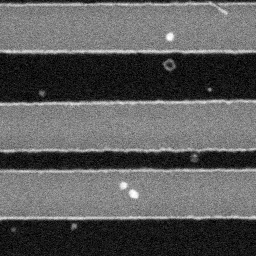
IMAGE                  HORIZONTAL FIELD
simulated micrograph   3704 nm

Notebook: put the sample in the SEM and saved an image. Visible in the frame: lines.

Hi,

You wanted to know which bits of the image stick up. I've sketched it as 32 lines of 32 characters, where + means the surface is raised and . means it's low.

++++++++++++++++++++++....+.....
................................
................................
................................
................................
................................
++++++++++++++++++++++++++++++++
++++++++++++++++++++++++++++++++
++++++++++++++++++++++++++++++++
++++++++++++++++++++++++++++++++
++++++++++++++++++++++++++++++++
++++++++++++++++++++++++++++++++
++++++++++++++++++++++++++++++++
................................
................................
................................
................................
................................
................................
++++++++++++++++++++++++++++++++
++++++++++++++++++++++++++++++++
................................
................................
................................
................................
................................
................................
++++++++++++++++++++++++++++++++
++++++++++++++++++++++++++++++++
++++++++++++++++++++++++++++++++
++++++++++++++++++++++++++++++++
++++++++++++++++++++++++++++++++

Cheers